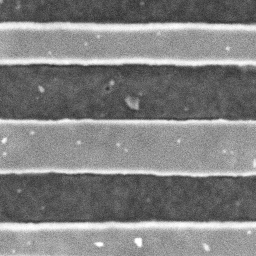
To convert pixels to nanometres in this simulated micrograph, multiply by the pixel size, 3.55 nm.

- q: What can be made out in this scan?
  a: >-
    lines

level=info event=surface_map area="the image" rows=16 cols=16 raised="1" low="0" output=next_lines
0000000000000000
1111100000010000
1111111111111111
1111111111111111
0000000000000000
0000000000000000
0000000000000000
1000110000000000
1111111111111111
1111111111111111
1111111111111111
0000000000000000
0000000000000000
0000000000000000
1111111111111111
1111111111111111